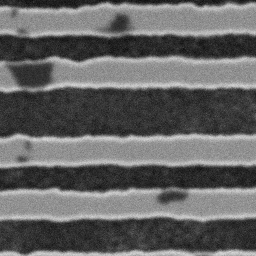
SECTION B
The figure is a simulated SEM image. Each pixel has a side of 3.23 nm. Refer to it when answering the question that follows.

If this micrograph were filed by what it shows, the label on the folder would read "lines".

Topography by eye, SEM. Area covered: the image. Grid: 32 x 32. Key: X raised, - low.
-------------X-X-------X-------X
XXXXXXXXXXXXXXXXXXXXXXXXXXXXXXXX
XXXXXXXXXXXXXXXXXXXXXXXXXXXXXXXX
XXXXXXXXXXXXXXXXXXXXXXXXXXXXXXXX
--XXXX------XXX-----------------
--------------------------------
--------------------------------
-----XXXX--XXXXXXXXXXXXXXXXXXXXX
XXXXXXXXXXXXXXXXXXXXXXXXXXXXXXXX
XXXXXXXXXXXXXXXXXXXXXXXXXXXXXXXX
XXXXXXXXXXXXXXXXXXXXXXXXXXXXXXXX
--------------------------------
--------------------------------
--------------------------------
--------------------------------
--------------------------------
--------------------------------
XXXXXXXXXXXXXXXXXXXXXXXXXXXXXXXX
XXXXXXXXXXXXXXXXXXXXXXXXXXXXXXXX
XXXXXXXXXXXXXXXXXXXXXXXXXXXXXXXX
XXXXXXXXXXXXXXXXXXXXXXXXXXXXXXXX
--------------------------------
--------------------------------
--------------------------------
XXXXXXXXXXXXXXXXXXXXXXXXXXXXXXXX
XXXXXXXXXXXXXXXXXXXXXXXXXXXXXXXX
XXXXXXXXXXXXXXXXXXXXXXXXXXXXXXXX
------XXX---------------XX------
--------------------------------
--------------------------------
--------------------------------
XX--XXX-X------XXXXXXXX----XXXXX